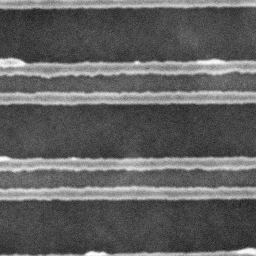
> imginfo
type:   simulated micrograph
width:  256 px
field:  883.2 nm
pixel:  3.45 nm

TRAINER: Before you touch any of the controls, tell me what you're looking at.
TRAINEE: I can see lines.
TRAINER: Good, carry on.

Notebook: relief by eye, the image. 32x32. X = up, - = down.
XXXXXXXXXXXXXXXXXXXXXXXXXXXXXXXX
--------------------------------
--------------------------------
--------------------------------
--------------------------------
--------------------------------
--------------------------------
XX------------------------X-----
XXXXXXXXXXXXXXXXXXXXXXXXXXXXXXXX
XXXXXXXXXXXXXXXXXXXXXXXXXXXXXXXX
XXXXXXXXXXXXXXXXXXXXXXXXXXXXXXXX
XXXXXXXXXXXXXXXXXXXXXXXXXXXXXXXX
XXXXXXXXXXXXXXXXXXXXXXXXXXXXXXXX
--------------------------------
--------------------------------
--------------------------------
--------------------------------
--------------------------------
--------------------------------
--------------------------------
XXXXXXXXXXXXXXXXXXXXXXXXXXXXXXXX
XXXXXXXXXXXXXXXXXXXXXXXXXXXXXXXX
XXXXXXXXXXXXXXXXXXXXXXXXXXXXXXXX
XXXXXXXXXXXXXXXXXXXXXXXXXXXXXXXX
XXXXXXXXXXXXXXXXXXXXXXXXXXXXXXXX
--------------------------------
--------------------------------
--------------------------------
--------------------------------
--------------------------------
--------------------------------
---------------------------X-XXX